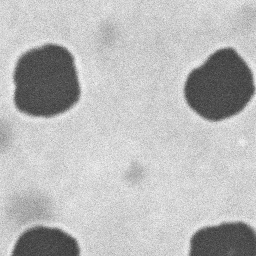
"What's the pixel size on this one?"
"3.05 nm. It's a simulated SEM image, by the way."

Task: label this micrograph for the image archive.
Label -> holes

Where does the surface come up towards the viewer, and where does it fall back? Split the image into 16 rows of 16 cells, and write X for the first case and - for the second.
XXXXXXXXXXXXXXXX
XXXXXXXXXXXXXXXX
XXXXXXXXXXXXXXXX
X----XXXXXXXX--X
X----XXXXXXX----
X----XXXXXXX----
X----XXXXXXX---X
XXXXXXXXXXXXX-XX
XXXXXXXXXXXXXXXX
XXXXXXXXXXXXXXXX
XXXXXXXXXXXXXXXX
XXXXXXXXXXXXXXXX
XXXXXXXXXXXXXXXX
XXXXXXXXXXXXXXXX
XX--XXXXXXXX----
X----XXXXXXX----